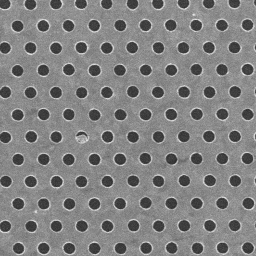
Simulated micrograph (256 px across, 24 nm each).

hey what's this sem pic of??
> a regular array of holes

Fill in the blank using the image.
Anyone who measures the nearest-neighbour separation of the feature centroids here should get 606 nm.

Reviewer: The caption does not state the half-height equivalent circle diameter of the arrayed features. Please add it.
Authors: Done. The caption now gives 289 nanometers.